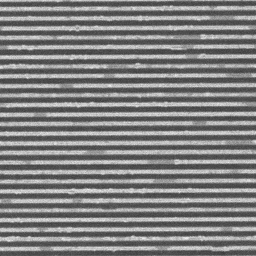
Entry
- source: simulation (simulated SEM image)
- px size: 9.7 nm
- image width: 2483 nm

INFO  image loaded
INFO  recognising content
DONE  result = parallel lines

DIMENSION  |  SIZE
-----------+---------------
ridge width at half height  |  0.0376 um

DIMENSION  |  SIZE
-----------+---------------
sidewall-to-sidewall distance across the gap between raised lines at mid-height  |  58.2 nanometers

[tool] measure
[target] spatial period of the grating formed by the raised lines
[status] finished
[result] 93.1 nm